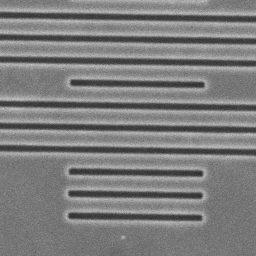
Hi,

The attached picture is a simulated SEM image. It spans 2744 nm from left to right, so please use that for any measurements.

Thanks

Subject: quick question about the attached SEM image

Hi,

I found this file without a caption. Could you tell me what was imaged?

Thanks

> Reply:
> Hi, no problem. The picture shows groups of lines, slits or small figures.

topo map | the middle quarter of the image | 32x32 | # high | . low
#####################...........
################################
################################
################################
#...............................
##..............................
################################
################################
################################
............####################
................................
#####################...........
################################
################################
################################
................................
................................
################################
################################
################################
.............###################
................................
#######.........................
################################
################################
################################
#...............................
#...............................
################################
################################
################################
#.............##################